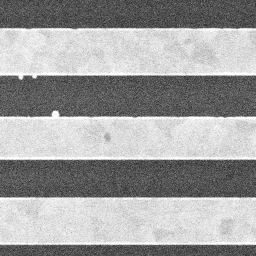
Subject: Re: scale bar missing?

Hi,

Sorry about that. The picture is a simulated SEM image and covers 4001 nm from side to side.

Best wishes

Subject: lines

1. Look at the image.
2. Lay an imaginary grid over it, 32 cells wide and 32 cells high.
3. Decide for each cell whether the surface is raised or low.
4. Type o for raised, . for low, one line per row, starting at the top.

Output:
................................
................................
................................
................................
oooooooooooooooooooooooooooooooo
oooooooooooooooooooooooooooooooo
oooooooooooooooooooooooooooooooo
oooooooooooooooooooooooooooooooo
oooooooooooooooooooooooooooooooo
................................
................................
................................
................................
................................
................................
oooooooooooooooooooooooooooooooo
oooooooooooooooooooooooooooooooo
oooooooooooooooooooooooooooooooo
oooooooooooooooooooooooooooooooo
oooooooooooooooooooooooooooooooo
................................
................................
................................
................................
................................
oooooooooooooooooooooooooooooooo
oooooooooooooooooooooooooooooooo
oooooooooooooooooooooooooooooooo
oooooooooooooooooooooooooooooooo
oooooooooooooooooooooooooooooooo
................................
................................